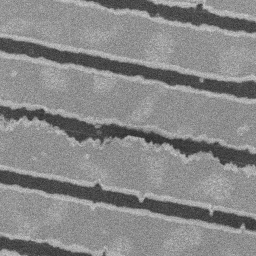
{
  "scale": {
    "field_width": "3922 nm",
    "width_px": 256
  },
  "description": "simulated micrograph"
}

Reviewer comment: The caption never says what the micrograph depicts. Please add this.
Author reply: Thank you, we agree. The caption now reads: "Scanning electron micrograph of one or a few lines or trenches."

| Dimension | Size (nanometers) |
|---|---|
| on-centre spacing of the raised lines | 990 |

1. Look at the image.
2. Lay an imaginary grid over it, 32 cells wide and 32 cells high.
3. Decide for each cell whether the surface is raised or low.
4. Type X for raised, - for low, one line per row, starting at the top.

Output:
XXXXXXXXXXXX----------XXXXXXXXXX
XXXXXXXXXXXXXXXXX----------XXXXX
XXXXXXXXXXXXXXXXXXXX------------
XXXXXXXXXXXXXXXXXXXXXXXXXX------
-XXXXXXXXXXXXXXXXXXXXXXXXXXXXXXX
------XXXXXXXXXXXXXXXXXXXXXXXXXX
-----------XXXXXXXXXXXXXXXXXXXXX
XXXXX-----------XXXXXXXXXXXXXXXX
XXXXXXXXXX------------XXXXXXXXXX
XXXXXXXXXXXXXXX------------XXXXX
XXXXXXXXXXXXXXXXXXXX------------
XXXXXXXXXXXXXXXXXXXXXXXXXX------
XXXXXXXXXXXXXXXXXXXXXXXXXXXXXX--
-----XXXXXXXXXXXXXXXXXXXXXXXXXXX
---------XXXXXXXXXXXXXXXXXXXXXXX
-XXXXX---------XXXXXXXXXXXXXXXXX
XXXXXXXX------------XXXXXXXXXXXX
XXXXXXXXX-----XXXX--------XXXXXX
XXXXXXXXXXXXXXXXXXXXXX---------X
XXXXXXXXXXXXXXXXXXXXXXX--X------
XXXXXXXXXXXXXXXXXXXXXXXXXXXX----
---XXXXXXXXXXXXXXXXXXXXXXXXXXXXX
--------XXXXXXXXXXXXXXXXXXXXXXXX
XX-----------XXXXXXXXXXXXXXXXXXX
XXXXXXX----------X-XXXXXXXXXXXXX
XXXXXXXXXXX-------------XXXXXXXX
XXXXXXXXXXXXXXXXXX-----------XXX
XXXXXXXXXXXXXXXXXXXXXX----------
XXXXXXXXXXXXXXXXXXXXXXXXXXXX----
-XXXXXXXXXXXXXXXXXXXXXXXXXXXXXXX
-------XXXXXXXXXXXXXXXXXXXXXXXXX
------------XXXXXXXXXXXXXXXXXXXX